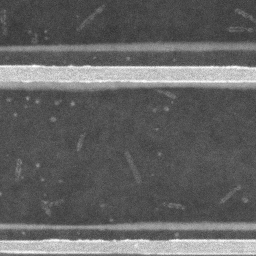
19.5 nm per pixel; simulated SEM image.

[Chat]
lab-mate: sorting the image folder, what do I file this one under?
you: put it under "lines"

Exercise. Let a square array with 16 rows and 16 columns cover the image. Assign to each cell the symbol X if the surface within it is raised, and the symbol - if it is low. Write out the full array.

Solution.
----------------
----------------
----------------
XXXXXXXXXXXXXXXX
XXXXXXXXXXXXXXXX
----------------
----------------
----------------
----------------
----------------
----------------
----------------
----------------
----------------
XXXXXXXXXXXXXXXX
XXXXXXXXXXXXXXXX